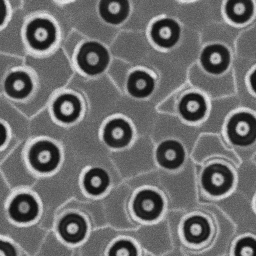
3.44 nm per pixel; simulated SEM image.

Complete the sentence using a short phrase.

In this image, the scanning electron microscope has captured a regular array of ring-shaped grooves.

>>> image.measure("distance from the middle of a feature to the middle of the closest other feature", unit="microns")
0.183